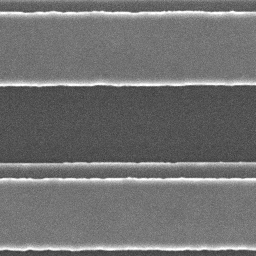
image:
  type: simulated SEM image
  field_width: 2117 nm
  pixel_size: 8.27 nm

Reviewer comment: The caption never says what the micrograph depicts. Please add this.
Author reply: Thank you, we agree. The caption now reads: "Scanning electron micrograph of lines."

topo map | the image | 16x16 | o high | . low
................
oooooooooooooooo
oooooooooooooooo
oooooooooooooooo
oooooooooooooooo
................
................
................
................
................
................
oooooooooooooooo
oooooooooooooooo
oooooooooooooooo
oooooooooooooooo
oooooooooooooooo